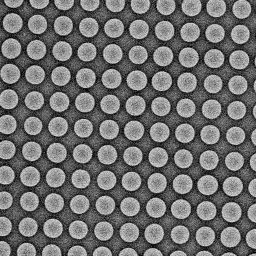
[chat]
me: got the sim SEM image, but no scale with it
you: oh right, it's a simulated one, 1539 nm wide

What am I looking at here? an array of small figures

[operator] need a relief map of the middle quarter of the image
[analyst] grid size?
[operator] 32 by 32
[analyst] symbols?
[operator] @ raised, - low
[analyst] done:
------------------------------@@
@---@@@----@@-------------------
@@-@@@@@--@@@@--@@@@---@@@----@@
@--@@@@@--@@@@--@@@@@-@@@@@--@@@
@--@@@@@--@@@@--@@@@@-@@@@@--@@@
----@@@---@@@@--@@@@--@@@@@--@@@
-----------------------@@----@@@
----@@--------------------------
@--@@@@---@@@---@@@----@@-------
@--@@@@@-@@@@@--@@@@--@@@@---@@@
@--@@@@--@@@@@--@@@@--@@@@--@@@@
----@@@---@@@---@@@@--@@@@--@@@@
-----------------@@----@@@---@@@
--------------------------------
@--@@@@---@@@----@--------------
@--@@@@--@@@@--@@@@@--@@@@---@@@
@--@@@@--@@@@@-@@@@@--@@@@--@@@@
---@@@@--@@@@--@@@@@--@@@@--@@@@
----------@@----@@@---@@@@--@@@@
-----------------------------@@-
---@@@----@---------------------
--@@@@@--@@@@--@@@@---@@@----@@-
@-@@@@@--@@@@--@@@@--@@@@@--@@@@
--@@@@@--@@@@--@@@@--@@@@@--@@@@
----@@---@@@---@@@@---@@@@--@@@@
-----------------------@@---@@@-
--------------------------------
--@@@@---@@@---@@@-----@--------
--@@@@--@@@@@--@@@@--@@@@---@@@@
--@@@@--@@@@@--@@@@--@@@@@-@@@@@
---@@@---@@@---@@@@--@@@@--@@@@@
----------------@@----@@@---@@@@